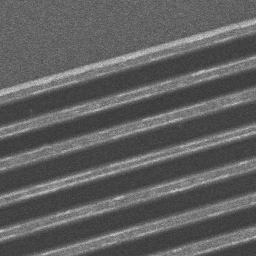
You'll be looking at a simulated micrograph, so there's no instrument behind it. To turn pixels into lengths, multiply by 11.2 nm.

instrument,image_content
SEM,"parallel lines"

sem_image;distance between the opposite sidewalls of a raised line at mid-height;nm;147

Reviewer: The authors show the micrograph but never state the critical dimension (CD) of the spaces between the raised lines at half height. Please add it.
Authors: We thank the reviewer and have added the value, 223 nanometres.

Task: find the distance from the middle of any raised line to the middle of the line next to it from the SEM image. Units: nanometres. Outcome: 369